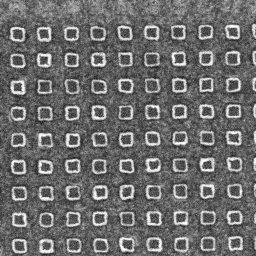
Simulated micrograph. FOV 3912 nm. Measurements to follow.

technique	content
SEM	a regular array of raised bodies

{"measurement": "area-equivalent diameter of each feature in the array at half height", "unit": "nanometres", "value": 217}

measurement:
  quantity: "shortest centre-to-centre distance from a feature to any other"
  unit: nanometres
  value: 402